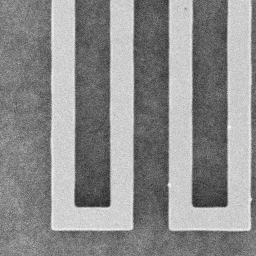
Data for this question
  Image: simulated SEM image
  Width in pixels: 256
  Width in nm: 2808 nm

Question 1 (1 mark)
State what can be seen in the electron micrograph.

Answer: groups of lines, slits or small figures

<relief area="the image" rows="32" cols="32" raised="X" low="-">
-------XX-----XXX----XXX-----XX-
-------XX-----XXX----XXX-----XX-
-------XX-----XXX----XXX-----XX-
-------XX-----XXX----XXX-----XX-
-------XX-----XXX----XXX-----XX-
-------XX-----XXX----XXX-----XX-
-------XX-----XXX----XXX-----XX-
-------XX-----XXX----XXX-----XX-
-------XX-----XXX----XXX-----XX-
-------XX-----XXX----XXX-----XX-
-------XX-----XXX----XXX-----XX-
-------XX-----XXX----XXX-----XX-
-------XX-----XXX----XXX-----XX-
-------XX-----XXX----XXX-----XX-
-------XX-----XXX----XXX-----XX-
-------XX-----XXX----XXX-----XX-
-------XX-----XXX----XXX-----XX-
-------XX-----XXX----XXX-----XX-
-------XX-----XXX----XXX-----XX-
-------XX-----XXX----XXX-----XX-
-------XX-----XXX----XXX-----XX-
-------XX-----XXX----XXX-----XX-
-------XX-----XXX----XXX-----XX-
-------XX-----XXX----XXX-----XX-
-------XX-----XXX----XXX-----XX-
-------XX-----XX-----XXX----XXX-
-------XXXXXXXXX-----XXXXXXXXXX-
-------XXXXXXXXX-----XXXXXXXXXX-
-------XXXXXXXXX-----XXXXXXXXXX-
--------------------------------
--------------------------------
--------------------------------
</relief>